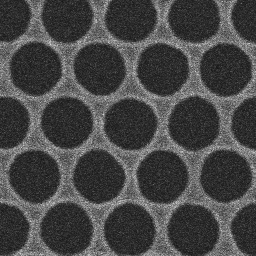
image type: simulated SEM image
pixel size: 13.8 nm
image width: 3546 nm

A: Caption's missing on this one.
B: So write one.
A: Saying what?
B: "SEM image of a regular array of holes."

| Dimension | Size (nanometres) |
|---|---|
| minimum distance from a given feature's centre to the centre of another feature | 859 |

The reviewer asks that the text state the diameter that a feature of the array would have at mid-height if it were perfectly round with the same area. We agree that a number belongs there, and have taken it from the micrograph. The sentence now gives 749 nm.